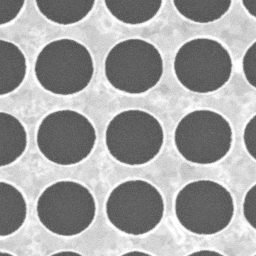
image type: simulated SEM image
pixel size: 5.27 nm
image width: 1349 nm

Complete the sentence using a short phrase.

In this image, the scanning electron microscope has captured a regular array of holes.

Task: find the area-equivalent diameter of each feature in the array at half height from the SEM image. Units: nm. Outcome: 310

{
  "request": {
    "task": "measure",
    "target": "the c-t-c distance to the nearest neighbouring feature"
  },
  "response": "69.2 px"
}